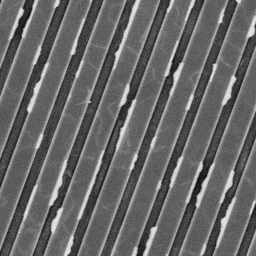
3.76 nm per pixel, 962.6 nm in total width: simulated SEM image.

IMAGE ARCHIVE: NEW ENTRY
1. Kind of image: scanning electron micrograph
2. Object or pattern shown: parallel lines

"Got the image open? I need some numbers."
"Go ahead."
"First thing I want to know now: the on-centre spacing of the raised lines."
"31.9 px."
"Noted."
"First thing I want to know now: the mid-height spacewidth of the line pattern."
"0.0357 µm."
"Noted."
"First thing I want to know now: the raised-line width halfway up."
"0.0843 µm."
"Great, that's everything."